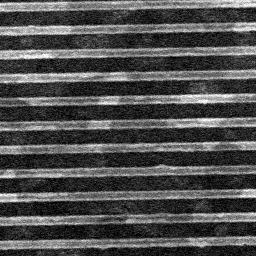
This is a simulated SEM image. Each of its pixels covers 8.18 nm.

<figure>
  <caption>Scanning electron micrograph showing parallel lines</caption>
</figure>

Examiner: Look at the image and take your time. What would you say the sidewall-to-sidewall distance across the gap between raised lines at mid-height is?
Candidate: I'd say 136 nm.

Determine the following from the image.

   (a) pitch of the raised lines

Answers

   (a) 0.195 µm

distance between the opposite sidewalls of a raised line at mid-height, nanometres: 60.3